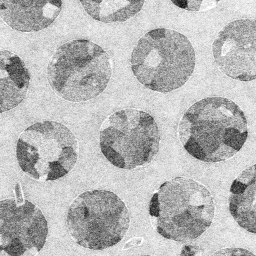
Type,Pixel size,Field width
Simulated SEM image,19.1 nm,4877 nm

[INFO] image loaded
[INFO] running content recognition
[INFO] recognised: raised bodies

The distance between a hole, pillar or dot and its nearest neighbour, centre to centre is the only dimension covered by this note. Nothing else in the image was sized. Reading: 1610 nanometres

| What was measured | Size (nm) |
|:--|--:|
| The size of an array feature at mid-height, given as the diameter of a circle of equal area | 1200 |